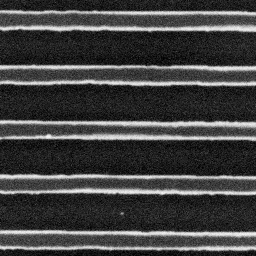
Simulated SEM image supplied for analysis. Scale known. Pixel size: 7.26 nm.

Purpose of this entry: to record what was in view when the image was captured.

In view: lines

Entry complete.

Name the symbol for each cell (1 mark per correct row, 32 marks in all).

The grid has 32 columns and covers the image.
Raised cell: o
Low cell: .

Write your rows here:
................................
ooo...o.........................
oooooooooooooooooooooooooooooooo
oooooooooooooooooooooooooooooooo
................................
................................
................................
................................
oooooooooooooooooooooooooooooooo
oooooooooooooooooooooooooooooooo
..oo..........oooooooooooooooooo
................................
................................
................................
................................
oooooooooooooooooooooooooooooooo
oooooooooooooooooooooooooooooooo
................................
................................
................................
................................
................................
oooooooooooooooooooooooooooooooo
oooooooooooooooooooooooooooooooo
................................
................................
................................
................................
................................
oooooooooooooooooooooooooooooooo
oooooooooooooooooooooooooooooooo
................................